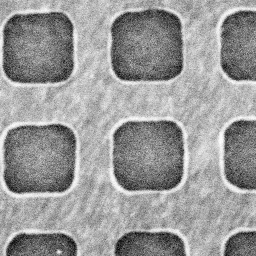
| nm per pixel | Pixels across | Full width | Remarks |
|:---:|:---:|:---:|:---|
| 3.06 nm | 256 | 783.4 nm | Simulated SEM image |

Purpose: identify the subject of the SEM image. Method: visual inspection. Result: holes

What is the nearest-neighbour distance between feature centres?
334 nm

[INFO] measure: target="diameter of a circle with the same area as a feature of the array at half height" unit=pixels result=80.1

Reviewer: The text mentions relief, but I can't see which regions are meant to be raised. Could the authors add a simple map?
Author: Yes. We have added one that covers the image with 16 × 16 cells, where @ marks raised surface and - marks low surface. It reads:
@@@@@@@@@@@@@@@@
-----@@----@@@--
-----@@----@@@--
-----@@----@@@--
-----@@----@@@--
@@@@@@@@@@@@@@@@
@@@@@@@@@@@@@@@@
@@@@@@@@---@@@@-
-----@@-----@@--
-----@@-----@@--
-----@@-----@@--
-----@@----@@@--
@@@@@@@@@@@@@@@@
@@@@@@@@@@@@@@@@
@-@@@@@@---@@@@-
-----@@-----@@--